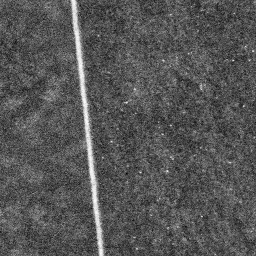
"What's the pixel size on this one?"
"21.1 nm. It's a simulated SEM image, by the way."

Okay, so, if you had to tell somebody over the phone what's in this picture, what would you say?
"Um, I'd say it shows one or a few lines or trenches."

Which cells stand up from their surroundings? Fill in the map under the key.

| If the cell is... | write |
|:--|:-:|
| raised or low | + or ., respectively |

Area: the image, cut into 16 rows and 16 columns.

+++++...........
+++++...........
+++++...........
+++++...........
+++++...........
+++++...........
+++++...........
+++++...........
+++++...........
++++++..........
++++++..........
++++++..........
++++++..........
++++++..........
++++++..........
++++++..........